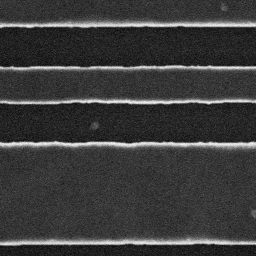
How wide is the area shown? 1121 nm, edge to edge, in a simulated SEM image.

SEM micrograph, lines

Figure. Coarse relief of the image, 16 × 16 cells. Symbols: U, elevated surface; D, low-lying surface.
UUUUUUUUUUUUUUUU
UUUUUUUUUUUUUUUU
DDDDDDDDDDDDDDDD
DDDDDDDDDDDDDDDD
UUUUUUUUUUUUUUUU
UUUUUUUUUUUUUUUU
DDDDDDDDDDDDDDDD
DDDDDDDDDDDDDDDD
DDDDDDDDDDDDDDDD
UUUUUUUUUUUUUUUU
UUUUUUUUUUUUUUUU
UUUUUUUUUUUUUUUU
UUUUUUUUUUUUUUUU
UUUUUUUUUUUUUUUU
UUUUUUUUUUUUUUUU
DDDDDDDDDDDDDDDD